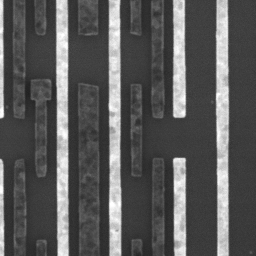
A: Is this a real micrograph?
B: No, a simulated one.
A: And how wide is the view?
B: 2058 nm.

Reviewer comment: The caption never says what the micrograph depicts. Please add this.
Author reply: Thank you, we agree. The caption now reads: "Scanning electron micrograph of wiring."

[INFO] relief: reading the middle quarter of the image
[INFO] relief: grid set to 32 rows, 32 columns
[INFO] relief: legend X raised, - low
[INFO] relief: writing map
X----------XXX--------XXX--XXX--
X----------XXX--------XXX--XXX--
X----------XXX--------XXX--XXX--
X----------XXX--------XXX--XXX--
X----------XXX--------XXX--XXX--
X---XXXX---XXX---XX---XXX--XXX--
X---XXXXX--XXX---XX---XXX--XXX--
X---XXXXX--XXX---XX---XXX--XXX--
X---XXXXX--XXX---XX---XXX--XXX--
X---XXXXX--XXX---XX---XXX--XXX--
X---XXXXX--XXX---XX---XXX--XXX--
X---XXXXX--XXX---XX---XXX--XXX--
X---XXXXX---XX---XX---XXX--XXX--
X---XXXXX---XX---XX-------------
X---XXXXX---XX---XX-------------
X---XXXXX---XX---XX-------------
X---XXXXX---XX---XX-------------
X---XXXXX---XX---XX-------------
X---XXXXX---XX---XX-------------
X---XXXXX---XX---XX-------------
X---XXXXX---XX---XX-------------
X---XXXXX---XX---XX-------------
X---XXXXX---XX---XX-------------
X---XXXXX---XX---XX-------------
X---XXXXX---XX---XX---XXX--XXX--
X---XXXXX---XX---XX---XXX--XXX--
X---XXXXX---XX---XX---XXX---XX--
X---XXXXX---XX---XX---XXX---XX--
X---XXXXX---XX--------XXX---XX--
X---XXXXX---XX--------XXX---XX--
X---XXXXX---XX--------XXX---XX--
X---XXXXX---XX--------XXX---XX--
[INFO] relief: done